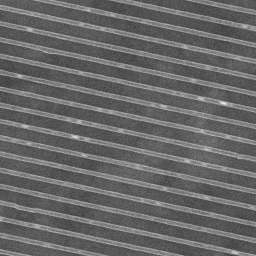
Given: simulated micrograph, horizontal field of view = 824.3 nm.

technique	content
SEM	parallel lines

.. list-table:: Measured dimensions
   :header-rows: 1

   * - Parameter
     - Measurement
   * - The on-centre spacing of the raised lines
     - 15.9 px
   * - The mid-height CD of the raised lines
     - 13.4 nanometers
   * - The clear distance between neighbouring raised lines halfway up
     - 37.4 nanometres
